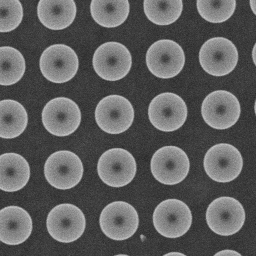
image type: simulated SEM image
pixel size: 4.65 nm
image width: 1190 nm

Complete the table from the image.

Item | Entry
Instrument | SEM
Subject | an array of small figures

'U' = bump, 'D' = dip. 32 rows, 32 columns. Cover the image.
UUUDDUUUUDDUUUUUDDUUUUUDDUUUUDDU
UUUDDUUUUUDUUUUUDDUUUUUDDUUUUDDD
UUUDDUUUUDDDUUUUDDDUUUDDDDUUDDDD
UUDDDDUUDDDDDDDDDDDDDDDDDDDDDDDD
DDDDDDDDDDDDDDDDDDDDDDDDDDDDDDDD
DDDDDDDDDDDDDUUDDDDUUUDDDUUUUDDD
UUDDDUUUUDDDUUUUDDUUUUUDDUUUUUDD
UUUDDUUUUUDDUUUUDDUUUUUDDUUUUUDD
UUUDDUUUUUDDUUUUDDUUUUUDDUUUUDDD
UUUDDUUUUDDDUUUUDDDUUUDDDDDUDDDD
UUDDDDDDDDDDDDDDDDDDDDDDDDDDDDDD
DDDDDDDDDDDDDDDDDDDDDDDDDDDUUDDD
UUDDDDUUUDDDDUUUDDDUUUUDDUUUUUDD
UUUDDUUUUUDDUUUUUDDUUUUDDUUUUUDD
UUUDDUUUUUDDUUUUUDDUUUUDDUUUUUDD
UUUDDUUUUUDDUUUUDDDUUUUDDDUUUDDD
UUUDDDUUUDDDDUUDDDDDDDDDDDDDDDDD
DDDDDDDDDDDDDDDDDDDDDDDDDDDDDDDD
DDDDDDDDDDDDDDDDDDDDUUDDDDUUUDDD
UUUDDDUUUUDDDUUUUDDUUUUDDDUUUUDD
UUUUDDUUUUDDUUUUUDDUUUUUDUUUUUDD
UUUUDDUUUUDDUUUUUDDUUUUUDDUUUUDD
UUUUDDUUUUDDDUUUDDDDUUUDDDDUUDDD
UUUDDDDUUDDDDDDDDDDDDDDDDDDDDDDD
DDDDDDDDDDDDDDDDDDDDDDDDDDDDDDDD
DDDDDDDDUDDDDDUUDDDDUUUDDDUUUUDD
UUUDDDUUUUDDDUUUUDDUUUUUDDUUUUUD
UUUUDDUUUUUDUUUUUDDUUUUUDDUUUUUD
UUUUDDUUUUUDDUUUUDDUUUUUDDUUUUDD
UUUUDDUUUUDDDUUUDDDDUUUDDDDDDDDD
DUDDDDDDDDDDDDDDDDDDDDDDDDDDDDDD
DDDDDDDDDDDDDDDDDDDDDDDDDDDUUUDD